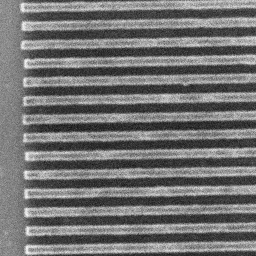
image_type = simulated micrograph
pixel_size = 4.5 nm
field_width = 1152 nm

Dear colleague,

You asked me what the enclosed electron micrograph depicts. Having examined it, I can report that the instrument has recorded parallel lines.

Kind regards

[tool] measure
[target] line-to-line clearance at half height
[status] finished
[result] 48.4 nanometres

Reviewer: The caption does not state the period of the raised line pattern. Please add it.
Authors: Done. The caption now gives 83.9 nm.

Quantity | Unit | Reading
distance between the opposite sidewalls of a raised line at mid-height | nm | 36